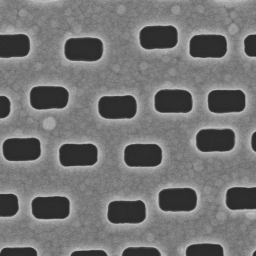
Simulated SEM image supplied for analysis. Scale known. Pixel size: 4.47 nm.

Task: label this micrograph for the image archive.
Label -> a regular array of holes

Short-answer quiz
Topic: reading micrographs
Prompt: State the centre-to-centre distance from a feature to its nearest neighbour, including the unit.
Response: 241 nm